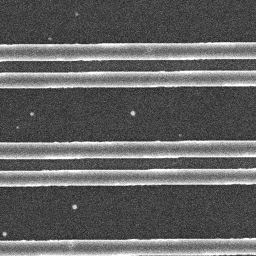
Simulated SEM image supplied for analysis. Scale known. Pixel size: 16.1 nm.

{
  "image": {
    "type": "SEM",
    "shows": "lines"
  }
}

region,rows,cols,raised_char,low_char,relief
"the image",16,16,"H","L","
LLLLLLLLLLLLLLLL
LLLLLLLLLLLLLLLL
LLLLLLLLLLLLLLLL
HHHHHHHHHHHHHHHH
HHHHHHHHHHHHHHHH
LLLLLLLLLLLLLLLL
LLLLLLLLLLLLLLLL
LLLLLLLLLLLLLLLL
LLLLLLLLLLLLLLLL
HHHHHHHHHHHHHHHH
HHHHHHHHHHHHHHHH
HHHHHHHHLLLLLLLL
LLLLLLLLLLLLLLLL
LLLLLLLLLLLLLLLL
LLLLLLLLLLLLLLLL
HHHHHHHHHHHHHHHH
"